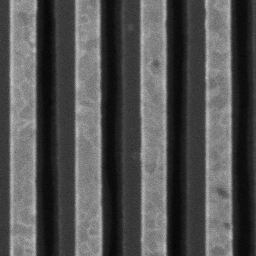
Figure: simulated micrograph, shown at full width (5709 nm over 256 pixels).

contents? lines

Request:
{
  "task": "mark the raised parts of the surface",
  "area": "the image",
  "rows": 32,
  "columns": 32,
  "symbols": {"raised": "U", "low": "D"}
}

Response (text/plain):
UUUUUDDUUUUUUDDUUUUUUDDUUUUUUDDD
UUUUUDDUUUUUUDDUUUUUUDDUUUUUUDDD
UUUUUDDUUUUUUDDUUUUUUDDUUUUUUDDD
UUUUUDDUUUUUUDDUUUUUUDDUUUUUUDDD
UUUUUDDUUUUUUDDUUUUUUDDDUUUUUDDD
UUUUUDDUUUUUUDDUUUUUUDDUUUUUUDDD
UUUUUDDUUUUUUDDUUUUUUDDDUUUUUDDD
UUUUUDDUUUUUUDDUUUUUUDDUUUUUUDDD
UUUUUDDUUUUUUDDUUUUUUDDUUUUUUDDD
UUUUUDDUUUUUUDDUUUUUUDDUUUUUUDDD
UUUUUDDUUUUUUDDUUUUUUDDUUUUUUDDD
UUUUUDDUUUUUUDDUUUUUUDDUUUUUUDDD
UUUUUDDUUUUUUDDUUUUUUDDUUUUUUDDD
UUUUUDDUUUUUUDDUUUUUUDDUUUUUUDDD
UUUUUDDUUUUUUDDUUUUUUDDUUUUUUDDD
UUUUUDDUUUUUUDDUUUUUUDDUUUUUUDDD
UUUUUDDUUUUUUDDUUUUUUDDUUUUUUDDD
UUUUUDDUUUUUUDDUUUUUUDDUUUUUUDDD
UUUUUDDUUUUUUDDUUUUUUDDUUUUUUDDD
UUUUUDDUUUUUUDDUUUUUUDDUUUUUUDDD
UUUUUDDUUUUUUDDUUUUUUDDUUUUUUDDD
UUUUUDDUUUUUUDDUUUUUUDDUUUUUUDDD
UUUUUDDUUUUUUDDUUUUUUDDUUUUUUDDD
UUUUUDDUUUUUUDDUUUUUUDDUUUUUUDDD
UUUUUDDUUUUUUDDUUUUUUDDUUUUUUDDD
UUUUUDDUUUUUUDDUUUUUUDDUUUUUUDDD
UUUUUDDUUUUUUDDUUUUUUDDUUUUUUDDD
UUUUUDDUUUUUUDDUUUUUUDDUUUUUUDDD
UUUUUDDUUUUUUDDUUUUUUDDUUUUUUDDD
UUUUUDDUUUUUUDDUUUUUUDDUUUUUUDDD
UUUUUDDUUUUUUDDUUUUUUDDUUUUUUDDD
UUUUUDDUUUUUUDDUUUUUUDDUUUUUUDDD